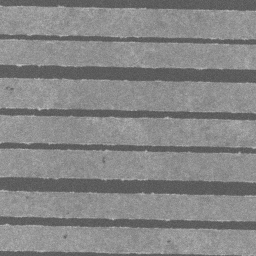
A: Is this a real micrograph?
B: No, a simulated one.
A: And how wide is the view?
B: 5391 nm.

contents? parallel lines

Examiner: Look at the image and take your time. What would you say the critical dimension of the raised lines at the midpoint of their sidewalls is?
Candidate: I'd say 516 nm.